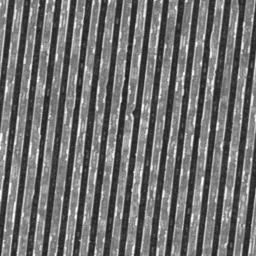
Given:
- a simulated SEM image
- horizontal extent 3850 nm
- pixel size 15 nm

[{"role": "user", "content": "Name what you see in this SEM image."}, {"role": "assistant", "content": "parallel lines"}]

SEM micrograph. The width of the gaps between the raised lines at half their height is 103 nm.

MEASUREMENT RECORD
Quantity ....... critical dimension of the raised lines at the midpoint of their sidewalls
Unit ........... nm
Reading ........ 133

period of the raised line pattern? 0.231 micrometres